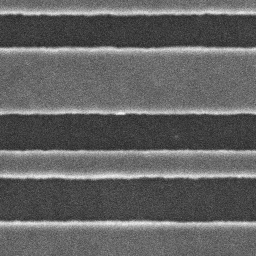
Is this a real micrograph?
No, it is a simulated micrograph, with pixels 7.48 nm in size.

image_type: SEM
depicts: lines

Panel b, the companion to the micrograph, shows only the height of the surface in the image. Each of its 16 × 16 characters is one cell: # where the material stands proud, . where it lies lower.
################
................
................
################
################
################
################
................
................
################
################
................
................
................
################
################